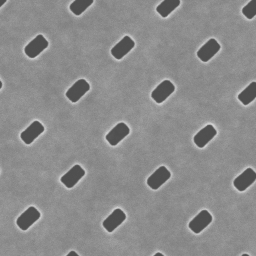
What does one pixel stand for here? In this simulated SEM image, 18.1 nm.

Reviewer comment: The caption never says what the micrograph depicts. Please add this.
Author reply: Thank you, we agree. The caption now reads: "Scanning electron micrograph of a regular array of holes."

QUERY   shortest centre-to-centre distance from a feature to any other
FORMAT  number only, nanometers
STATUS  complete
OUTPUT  1090